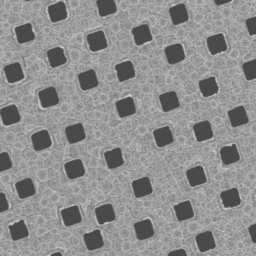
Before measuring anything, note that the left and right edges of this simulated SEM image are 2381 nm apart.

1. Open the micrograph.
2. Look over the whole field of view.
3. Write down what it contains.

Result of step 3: a regular array of holes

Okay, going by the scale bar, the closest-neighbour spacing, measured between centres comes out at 352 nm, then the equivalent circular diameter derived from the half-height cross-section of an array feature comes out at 184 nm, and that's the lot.